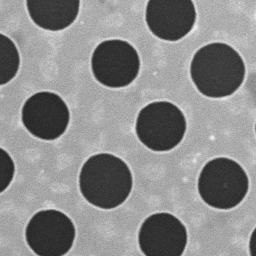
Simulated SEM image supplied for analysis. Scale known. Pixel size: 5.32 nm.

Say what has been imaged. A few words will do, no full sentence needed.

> holes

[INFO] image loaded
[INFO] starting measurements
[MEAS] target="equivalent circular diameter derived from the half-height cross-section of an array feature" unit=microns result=0.271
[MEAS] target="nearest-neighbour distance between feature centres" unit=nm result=418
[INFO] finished